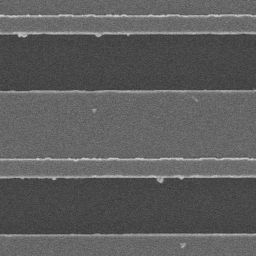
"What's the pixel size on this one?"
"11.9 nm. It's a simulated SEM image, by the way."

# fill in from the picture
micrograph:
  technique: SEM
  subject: lines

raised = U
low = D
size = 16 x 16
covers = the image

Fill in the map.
UUUUUUUUUUUUUUUU
UUUUUUUUUUUUUUUU
DDDDDDDDDDDDDDDD
DDDDDDDDDDDDDDDD
DDDDDDDDDDDDDDDD
DDDDDDDDDDDDDDDD
UUUUUUUUUUUUUUUU
UUUUUUUUUUUUUUUU
UUUUUUUUUUUUUUUU
UUUUUUUUUUUUUUUU
UUUUUUUUUUUUUUUU
DDDDDDDDDDDDDDDD
DDDDDDDDDDDDDDDD
DDDDDDDDDDDDDDDD
DDDDDDDDDDDDDDDD
UUUUUUUUUUUUUUUU